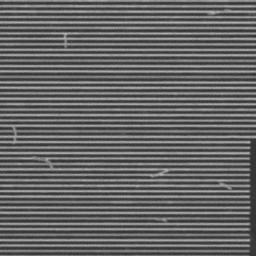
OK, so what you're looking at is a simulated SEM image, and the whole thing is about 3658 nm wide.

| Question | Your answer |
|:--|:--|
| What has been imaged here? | parallel lines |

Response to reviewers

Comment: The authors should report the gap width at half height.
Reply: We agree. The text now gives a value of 62.5 nanometres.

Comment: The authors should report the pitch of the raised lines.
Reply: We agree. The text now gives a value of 0.0777 microns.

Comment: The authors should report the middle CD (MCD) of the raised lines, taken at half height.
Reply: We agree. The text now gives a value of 21.4 nm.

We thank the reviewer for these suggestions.